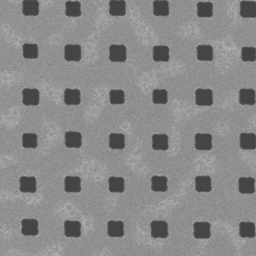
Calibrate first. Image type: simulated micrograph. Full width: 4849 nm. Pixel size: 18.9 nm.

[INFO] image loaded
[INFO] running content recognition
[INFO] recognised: a regular array of holes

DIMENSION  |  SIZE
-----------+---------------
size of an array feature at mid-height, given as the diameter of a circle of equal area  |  340 nanometers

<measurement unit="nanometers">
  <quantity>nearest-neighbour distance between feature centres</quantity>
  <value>812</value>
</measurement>